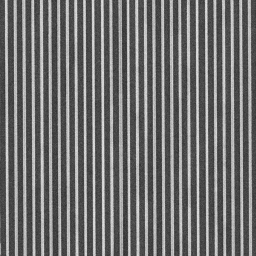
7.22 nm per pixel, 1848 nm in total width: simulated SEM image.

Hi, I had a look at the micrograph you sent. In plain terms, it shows parallel lines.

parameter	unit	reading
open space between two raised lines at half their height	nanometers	43.3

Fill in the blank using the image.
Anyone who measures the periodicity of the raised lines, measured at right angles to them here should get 62.7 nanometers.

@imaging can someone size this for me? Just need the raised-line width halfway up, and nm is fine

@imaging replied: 18.9